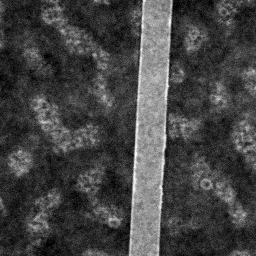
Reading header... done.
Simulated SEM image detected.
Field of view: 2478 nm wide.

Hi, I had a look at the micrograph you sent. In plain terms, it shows one or a few lines or trenches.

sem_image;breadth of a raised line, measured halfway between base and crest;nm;279